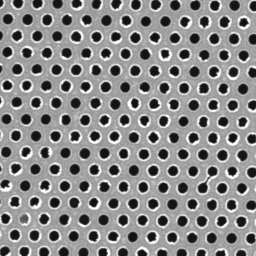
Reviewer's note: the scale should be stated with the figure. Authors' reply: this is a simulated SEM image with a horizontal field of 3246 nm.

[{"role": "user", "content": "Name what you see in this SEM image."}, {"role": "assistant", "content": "a regular array of holes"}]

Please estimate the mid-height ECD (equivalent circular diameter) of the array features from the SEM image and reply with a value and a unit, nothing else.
0.133 microns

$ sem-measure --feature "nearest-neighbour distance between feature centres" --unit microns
0.239